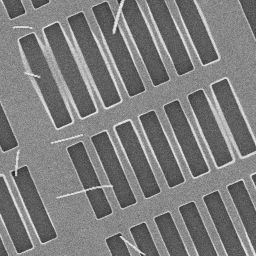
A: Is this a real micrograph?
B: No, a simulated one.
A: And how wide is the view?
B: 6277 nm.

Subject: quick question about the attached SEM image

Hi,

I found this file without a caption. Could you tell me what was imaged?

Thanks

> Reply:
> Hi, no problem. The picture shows groups of lines, slits or small figures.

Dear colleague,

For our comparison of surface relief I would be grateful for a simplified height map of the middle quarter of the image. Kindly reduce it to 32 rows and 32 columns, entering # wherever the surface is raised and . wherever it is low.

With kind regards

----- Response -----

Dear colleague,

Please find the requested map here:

....#......##.....##.....###....
....##.....##.....###.....##....
.....#......##.....##.....##..##
.....##.....##.....###....######
......#......##.....##....######
......##.....##.....############
#.....##.....###....############
#......##.....##...#############
##.....##.....#################.
.#......##....#############..##.
.##.....##..#############....###
.##.....#################.....##
..##...#############...###....##
..##.##############....###.....#
..#############..##.....##.....#
#############....##.....###.....
#############.....##.....##.....
########...##.....##.....##.....
#######....###.....##.....##....
#######.....##.....##.....##....
##...###....##......##.....##...
#....###.....##.....##.....##...
#.....##.....##.....##......##..
##....###.....##.....##.....##..
##.....##.....##.....##.....###.
##.....###....###.....##.....##.
###.....##.....##.....##.....##.
###.....###....###....###.....##
####....###.....##.....##.....##
####.....##.....##.....###....##
#####....###.....##.....##..####
#####.....##.....##.....########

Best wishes